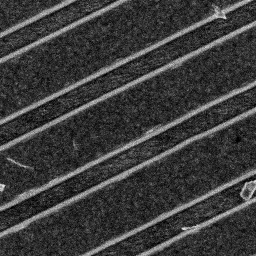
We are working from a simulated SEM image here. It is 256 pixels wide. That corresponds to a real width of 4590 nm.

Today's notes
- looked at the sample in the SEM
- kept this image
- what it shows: one or a few lines or trenches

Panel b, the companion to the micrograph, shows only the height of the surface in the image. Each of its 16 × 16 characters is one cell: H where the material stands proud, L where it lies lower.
HHHLLLLHHHHHHHLL
HLLLLHHHHHHHLLLL
LLLHHHHHHHLLLLHH
LHHHHHHHLLLLHHHH
HHHHHHLLLLHHHHHH
HHHHLLLLHHHHHHHL
HHLLLLHHHHHHHLLL
LLLLHHHHHHHLLLLH
LLHHHHHHHLLLLHHH
HHHHHHHLLLLHHHHH
HHHHHLLLLHHHHHHH
HHHLLLLHHHHHHHLL
HLLLLHHHHHHHLLLL
LLLHHHHHHHLLLLHH
HHHHHHHHLLLLHHHH
HHHHHHLLLLHHHHHH